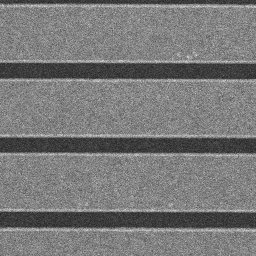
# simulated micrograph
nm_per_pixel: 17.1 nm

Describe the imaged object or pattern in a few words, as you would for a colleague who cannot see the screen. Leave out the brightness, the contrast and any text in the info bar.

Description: one or a few lines or trenches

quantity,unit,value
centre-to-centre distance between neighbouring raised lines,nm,1270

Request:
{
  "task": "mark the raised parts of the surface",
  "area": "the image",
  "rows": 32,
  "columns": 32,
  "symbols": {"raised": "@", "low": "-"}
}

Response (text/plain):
--------------------------------
@@@@@@@@@@@@@@@@@@@@@@@@@@@@@@@@
@@@@@@@@@@@@@@@@@@@@@@@@@@@@@@@@
@@@@@@@@@@@@@@@@@@@@@@@@@@@@@@@@
@@@@@@@@@@@@@@@@@@@@@@@@@@@@@@@@
@@@@@@@@@@@@@@@@@@@@@@@@@@@@@@@@
@@@@@@@@@@@@@@@@@@@@@@@@@@@@@@@@
@@@@@@@@@@@@@@@@@@@@@@@@@@@@@@@@
--------------------------------
--------------------------------
@@@@@@@@@@@@@@@@@@@@@@@@@@@@@@@@
@@@@@@@@@@@@@@@@@@@@@@@@@@@@@@@@
@@@@@@@@@@@@@@@@@@@@@@@@@@@@@@@@
@@@@@@@@@@@@@@@@@@@@@@@@@@@@@@@@
@@@@@@@@@@@@@@@@@@@@@@@@@@@@@@@@
@@@@@@@@@@@@@@@@@@@@@@@@@@@@@@@@
@@@@@@@@@@@@@@@@@@@@@@@@@@@@@@@@
--------------------------------
--------------------------------
@@@@@@@@@@@@@@@@@@@@@@@@@@@@@@@@
@@@@@@@@@@@@@@@@@@@@@@@@@@@@@@@@
@@@@@@@@@@@@@@@@@@@@@@@@@@@@@@@@
@@@@@@@@@@@@@@@@@@@@@@@@@@@@@@@@
@@@@@@@@@@@@@@@@@@@@@@@@@@@@@@@@
@@@@@@@@@@@@@@@@@@@@@@@@@@@@@@@@
@@@@@@@@@@@@@@@@@@@@@@@@@@@@@@@@
--------------------------------
--------------------------------
--------------------------------
@@@@@@@@@@@@@@@@@@@@@@@@@@@@@@@@
@@@@@@@@@@@@@@@@@@@@@@@@@@@@@@@@
@@@@@@@@@@@@@@@@@@@@@@@@@@@@@@@@